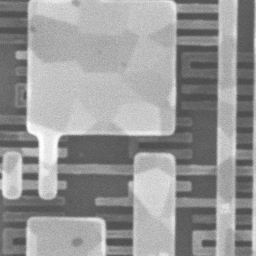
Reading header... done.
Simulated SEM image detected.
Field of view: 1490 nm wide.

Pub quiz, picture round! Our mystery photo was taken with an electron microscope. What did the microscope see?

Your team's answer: wiring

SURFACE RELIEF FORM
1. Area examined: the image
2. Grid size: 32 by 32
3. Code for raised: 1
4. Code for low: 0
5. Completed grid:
00001111111111111111110000011100
00001111111111111111110000011100
00001111111111111111110000011100
00001111111111111111110000011100
00001111111111111111110000011100
00001111111111111111110000011100
00001111111111111111110000011100
00001111111111111111110000011100
00001111111111111111110000011000
00001111111111111111110000011000
00001111111111111111110000011000
00011111111111111111110000011000
00011111111111111111110000011000
00011111111111111111110000011000
00011111111111111111110000011000
00011111111111111111110000011000
00001111111111111111110000011000
00000110000000000000000000011000
00000110000000000000000000011000
01100110000000000111110000011000
11100110000000000111110000011000
11100110000000000111110000011000
11100110000000000111110000011000
11100110000000000111110000011000
01000110000000000111110000011000
00000000000000000111110000011000
00000000000000000111110000011000
00001111111110000111110000011000
00011111111110000111110000011000
00011111111110000111110000011000
00011111111110000111110000011000
00011111111110000111110000011000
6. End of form